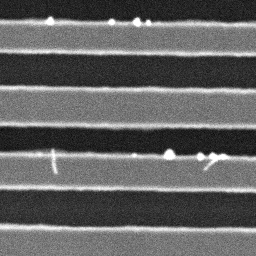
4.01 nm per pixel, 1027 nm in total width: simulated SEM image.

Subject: lines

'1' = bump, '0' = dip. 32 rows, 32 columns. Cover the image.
00000000000000000000000000000000
00000000000000000000000000000000
00000010000000000000000000000000
11111111111111111111111111111111
11111111111111111111111111111111
11111111111111111111111111111111
00111111111111111111111111111111
00000000000000000000000000000000
00000000000000000000000000000000
00000000000000000000000000000000
00000000000000000000000000000000
11111111111111111111111111111111
11111111111111111111111111111111
11111111111111111111111111111111
11111111111111111111111111111111
11111111111111111111111111111111
00000000000000000000000000000000
00000000000000000000000000000000
00000000000000000000000000000000
11111111111111001000110001110000
11111111111111111111111111111111
11111111111111111111111111111111
11111111111111111111111111111111
01111111111111111111111111111111
00000000000000000000000000000000
00000000000000000000000000000000
00000000000000000000000000000000
00000000000000000000000000000000
11111111111110000000000000000000
11111111111111111111111111111111
11111111111111111111111111111111
11111111111111111111111111111111